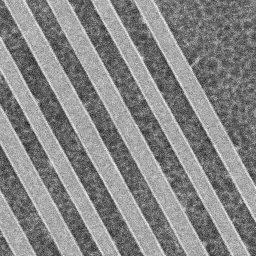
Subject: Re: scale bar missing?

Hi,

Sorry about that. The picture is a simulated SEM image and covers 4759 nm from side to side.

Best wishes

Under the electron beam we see parallel lines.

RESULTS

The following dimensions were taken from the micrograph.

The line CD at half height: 320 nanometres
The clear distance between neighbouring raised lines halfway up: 21.6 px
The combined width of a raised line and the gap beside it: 695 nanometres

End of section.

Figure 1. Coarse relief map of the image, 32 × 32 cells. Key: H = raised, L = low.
LHHLLLHHHLLLHHLLLHHLLLLLLLLLLLLL
LHHHLLLHHLLLHHLLLLHHLLLLLLLLLLLL
LLHHLLLHHHLLLHHLLLHHLLLLLLLLLLLL
LLHHHLLLHHLLLHHLLLLHHLLLLLLLLLLL
LLLHHLLLHHHLLLHHLLLHHLLLLLLLLLLL
LLLLHHLLLHHLLLLHHLLLHHLLLLLLLLLL
HLLLHHHLLHHHLLLHHLLLHHHLLLLLLLLL
HHLLLHHLLLHHHLLLHHLLLHHLLLLLLLLL
HHLLLHHHLLHHHLLLHHLLLHHHLLLLLLLL
LHHLLLHHLLLHHHLLLHHLLLHHLLLLLLLL
LHHLLLHHHLLLHHLLLHHLLLLHHLLLLLLL
LLHHLLLHHLLLHHHLLLHHLLLHHLLLLLLL
LLHHLLLHHHLLLHHLLLHHLLLLHHLLLLLL
LLLHHLLLHHHLLHHHLLLHHLLLHHHLLLLL
HLLHHLLLHHHLLLHHLLLHHHLLLHHLLLLL
HLLLHHLLLHHHLLHHHLLLHHLLLHHHLLLL
HHLLHHLLLLHHLLLHHLLLLHHLLLHHLLLL
HHLLLHHLLLHHHLLLHHLLLHHLLLHHHLLL
HHHLLLHHLLLHHLLLHHHLLLHHLLLHHLLL
LHHLLLHHLLLHHHLLLHHLLLHHLLLLHHLL
LLHHLLLHHLLLHHLLLHHHLLLHHLLLHHLL
LLHHHLLHHLLLHHHLLLHHLLLHHLLLLHHL
LLLHHLLLHHLLLHHLLLHHHLLLHHLLLHHL
LLLHHHLLHHLLLHHHLLLHHLLLHHHLLLHH
LLLLHHLLLHHLLLHHLLLHHHLLLHHLLLHH
HLLLHHHLLHHLLLLHHLLLHHLLLLHHLLLH
HLLLLHHLLLHHLLLHHHLLLHHLLLHHLLLH
HHLLLHHHLLHHHLLLHHLLLHHHLLLHHLLL
HHHLLLHHLLLHHLLLHHHLLLHHLLLHHLLL
LHHLLLLHHLLLHHLLLHHLLLHHHLLLHHLL
LHHHLLLHHLLLHHLLLHHHLLLHHLLLHHLL
LLHHLLLLHHLLLHHLLLHHLLLHHHLLLHHL